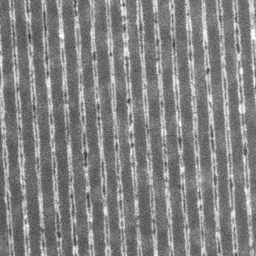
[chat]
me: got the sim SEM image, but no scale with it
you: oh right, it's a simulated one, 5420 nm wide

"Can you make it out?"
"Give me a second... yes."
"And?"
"parallel lines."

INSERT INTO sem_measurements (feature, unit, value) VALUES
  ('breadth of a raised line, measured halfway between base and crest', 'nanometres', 58.1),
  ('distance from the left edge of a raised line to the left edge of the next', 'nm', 338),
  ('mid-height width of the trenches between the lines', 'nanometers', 267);